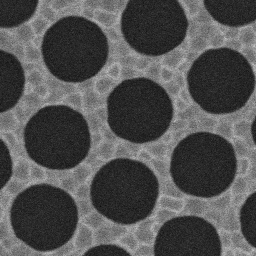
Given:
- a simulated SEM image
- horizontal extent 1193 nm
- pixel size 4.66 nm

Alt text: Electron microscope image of holes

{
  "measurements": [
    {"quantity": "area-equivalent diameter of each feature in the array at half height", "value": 310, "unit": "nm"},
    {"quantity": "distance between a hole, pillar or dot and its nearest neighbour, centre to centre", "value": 381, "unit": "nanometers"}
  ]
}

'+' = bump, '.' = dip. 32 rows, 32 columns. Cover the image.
.....+++++++++++......++++......
....+++++++++++........+++......
...++++....++++........++++.....
.+++++......+++........+++++++++
+++++........++........+++++++++
+++++........+++......++++++++++
.++++.........+++....+++++....++
..+++........+++++++++++.......+
...+++.......+++++++++++.......+
...++++.....+++++++++++.........
...++++++++++++.....+++.........
...+++++++++++.......+++........
..+++++++++++........+++.......+
.++++....++++.........+++.....++
++++......+++.........++++++++++
+++........+++.......++++++++++.
+++........+++.......++++.+++++.
+++........+++++...++++.....++++
.++........+++++++++++.......+++
.+++.......+++++++++++.......+++
..+++.....+++.....+++.........++
..++++++++++.......++.........++
.+++++++++++........++.......+++
+++....++++.........++......++++
++.......++.........++++...++++.
++.......+++.......+++++++++++..
+.........++.......+++++++++++..
+.........++++....+++.....++++..
++.......+++++++++++.......+++..
++.......+++++++++++.......+++..
+++.....+++++++++++.........+++.
+++++++++++.....+++.........++++